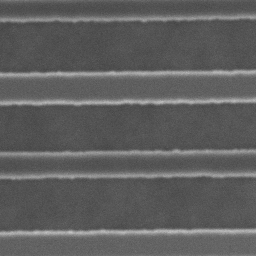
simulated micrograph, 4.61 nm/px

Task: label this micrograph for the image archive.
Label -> lines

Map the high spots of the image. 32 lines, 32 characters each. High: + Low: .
++++++++++++++++++++++++++++++++
++++++++++++++++++++++++++++++++
+++++++++++++++++++.+...........
................................
................................
................................
................................
................................
................................
++++++++++++++++++++++++++++++++
++++++++++++++++++++++++++++++++
++++++++++++++++++++++++++++++++
++++++++++++++++++++++++++++++++
................................
................................
................................
................................
................................
................................
++++++++++++++++++++++++++++++++
++++++++++++++++++++++++++++++++
++++++++++++++++++++++++++++++++
................................
................................
................................
................................
................................
................................
................................
++++++++++++++++++++++++++++++++
++++++++++++++++++++++++++++++++
++++++++++++++++++++++++++++++++